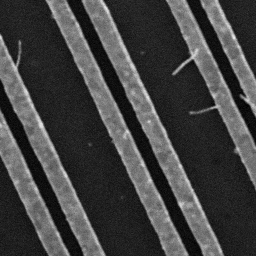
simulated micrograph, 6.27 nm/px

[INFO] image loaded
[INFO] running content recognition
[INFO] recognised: lines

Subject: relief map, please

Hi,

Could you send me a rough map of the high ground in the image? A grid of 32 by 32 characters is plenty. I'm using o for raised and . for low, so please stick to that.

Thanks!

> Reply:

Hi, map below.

......oo..ooo........oo..oo.....
.......oo..ooo.......ooo..oo....
.......oo..ooo........oo..oo....
.......ooo..oo.........oo..oo...
........oo..ooo........oo..oo...
o.......ooo..oo........ooo..oo..
o........oo..ooo........oo..oo..
o........ooo..oo........ooo..oo.
oo........oo..ooo........oo..oo.
oo........ooo..oo........ooo..oo
ooo........oo..ooo........oo..oo
.oo........ooo..oo........ooo..o
.ooo........oo..ooo........oo..o
..oo........ooo..oo........ooo.o
..ooo........oo..ooo........oo..
o..oo........ooo..oo........ooo.
o..ooo........oo..ooo........oo.
oo..oo........ooo..oo........ooo
oo..ooo........oo..ooo........oo
ooo..oo........ooo..oo........oo
.oo..ooo.......ooo..ooo........o
.ooo..oo........oo..ooo........o
..oo..ooo.......ooo..ooo.......o
..ooo..oo........oo..ooo........
..ooo..ooo.......ooo..oo........
...ooo..oo........oo..ooo.......
...ooo..ooo.......ooo..oo.......
....oo..ooo........oo..ooo......
....ooo..oo........ooo..oo......
.....oo..ooo........oo..ooo.....
.....ooo..oo........ooo..oo.....
......oo..ooo........oo..ooo....